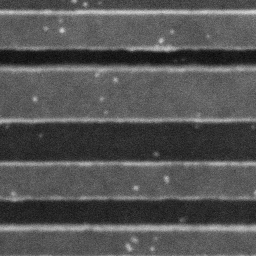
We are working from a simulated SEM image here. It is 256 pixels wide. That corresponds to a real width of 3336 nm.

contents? lines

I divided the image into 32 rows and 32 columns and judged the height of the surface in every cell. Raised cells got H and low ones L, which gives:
LLLLLLLLLLLLLLLLLLLLLLLLLLLLLLLL
LLLLLLLLLLLLLLLLLLLLLLLLLLLLLLLL
HHHHHHHHHHHHHHHHHHHHHHHHHHHHHHHH
HHHHHHHHHHHHHHHHHHHHHHHHHHHHHHHH
HHHHHHHHHHHHHHHHHHHHHHHHHHHHHHHH
HHHHHHHHHHHHHHHHHHHHHHHHHHHHHHHH
LLLLLLLLLLLLLLLLLLLLLLLLLLLLLLLL
LLLLLLLLLLLLLLLLLLLLLLLLLLLLLLLL
LLLLLLHHHHHLLLLHLHHLLLLLHLLLLHHH
HHHHHHHHHHHHHHHHHHHHHHHHHHHHHHHH
HHHHHHHHHHHHHHHHHHHHHHHHHHHHHHHH
HHHHHHHHHHHHHHHHHHHHHHHHHHHHHHHH
HHHHHHHHHHHHHHHHHHHHHHHHHHHHHHHH
HHHHHHHHHHHHHHHHHHHHHHHHHHHHHHHH
HHHHHHHHHHHHHHHHHHHHHHHHHHHHHHHH
LLLLLLLLLLLLLLLLLLLLLLLLLLLLLLLL
LLLLLLLLLLLLLLLLLLLLLLLLLLLLLLLL
LLLLLLLLLLLLLLLLLLLLLLLLLLLLLLLL
LLLLLLLLLLLLLLLLLLLLLLLLLLLLLLLL
LLLLLLLLLLLLLLLLLLLLLLLLLLLLLLLL
HHHHHHHHHHHHHHHHHHHHHHHHHHHHHHHH
HHHHHHHHHHHHHHHHHHHHHHHHHHHHHHHH
HHHHHHHHHHHHHHHHHHHHHHHHHHHHHHHH
HHHHHHHHHHHHHHHHHHHHHHHHHHHHHHHH
HHHHHHHHHHHHHHHHHHHHHHHHHHHHHHHH
LLLLLLLLLLLLLLLLLLLLLLLLLLLLLLLL
LLLLLLLLLLLLLLLLLLLLLLLLLLLLLLLL
LLLLLLLLLLLLLLLLLLLLLLLLLLLLLLLL
LLLLLLLLLLLLLLLLLLLLLLLLLLLLLLLL
HHHHHHHHHHHHHHHHHHHHHHHHHHHHHHHH
HHHHHHHHHHHHHHHHHHHHHHHHHHHHHHHH
HHHHHHHHHHHHHHHHHHHHHHHHHHHHHHHH